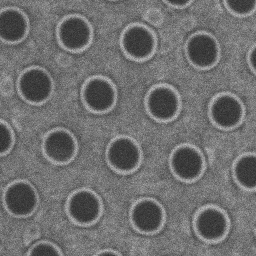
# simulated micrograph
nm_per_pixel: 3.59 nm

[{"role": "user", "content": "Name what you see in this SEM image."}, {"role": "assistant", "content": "a regular array of raised bodies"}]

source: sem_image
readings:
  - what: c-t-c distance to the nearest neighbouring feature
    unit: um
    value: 0.231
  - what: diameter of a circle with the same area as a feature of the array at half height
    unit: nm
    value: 130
